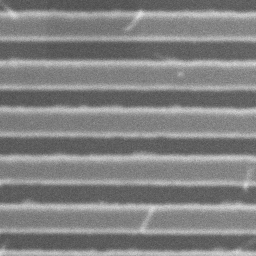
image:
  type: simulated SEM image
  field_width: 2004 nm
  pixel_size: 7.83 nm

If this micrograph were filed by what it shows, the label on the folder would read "lines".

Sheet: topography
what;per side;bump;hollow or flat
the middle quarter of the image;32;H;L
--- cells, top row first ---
HHHHHHHHHHHHHHHHHHHHHHHHHHHHHHHH
HHHHHHHHHHHHHHHHHHHHHHHHHHHHHHHH
HHHHHHHHHHHHHHHHHHHHHHHHHHHHHHHH
HHHHHHHHHHHHHHHHHHHHHHHHHHHHHHHH
HHHHHHHHHHHHHHHHHHHHHHHHHHHHHHHH
HHHHHHHHHHHHHHHHHHHHHHHHHHHHHHHH
LLLLLLLLLLLLLLLLLLLLLLLLLLLLLLLL
LLLLLLLLLLLLLLLLLLLLLLLLLLLLLLLL
LLLLLLLLLLLLLLLLLLLLLLLLLLLLLLLL
LLLLLLLLLLLLLLLLLLLLLLLLLLLLLLLL
LLLLLLLLLLLLLLLLLLLLLLLLLLLLLLLL
HHHHHHHHHHHHHHHHHHHHHHHHHHHHHHHH
HHHHHHHHHHHHHHHHHHHHHHHHHHHHHHHH
HHHHHHHHHHHHHHHHHHHHHHHHHHHHHHHH
HHHHHHHHHHHHHHHHHHHHHHHHHHHHHHHH
HHHHHHHHHHHHHHHHHHHHHHHHHHHHHHHH
HHHHHHHHHHHHHHHHHHHHHHHHHHHHHHHH
HHHHHHHHHHHHHHHHHHHHHHHHHHHHHHHH
LLLLLLLLLLLLLLLLLLLLLLLLLLLLLLLL
LLLLLLLLLLLLLLLLLLLLLLLLLLLLLLLL
LLLLLLLLLLLLLLLLLLLLLLLLLLLLLLLL
LLLLLLLLLLLLLLLLLLLLLLLLLLLLLLLL
LLLLLLLLLLLLLLLLLLLLLLLLLLLLLLLL
HHHHHHHHHHHHHHHHHHHHHHHHHHHHHHHH
HHHHHHHHHHHHHHHHHHHHHHHHHHHHHHHH
HHHHHHHHHHHHHHHHHHHHHHHHHHHHHHHH
HHHHHHHHHHHHHHHHHHHHHHHHHHHHHHHH
HHHHHHHHHHHHHHHHHHHHHHHHHHHHHHHH
HHHHHHHHHHHHHHHHHHHHHHHHHHHHHHHH
HHHHHHHHHHHHHHHHHHHHHHHHHHHHHHHH
LLLLLLLLLLLLLLLLLLLLLLLLLLLLLLLL
LLLLLLLLLLLLLLLLLLLLLLLLLLLLLLLL